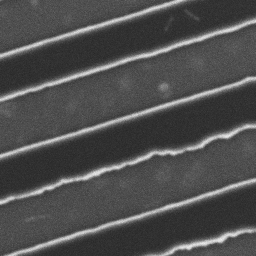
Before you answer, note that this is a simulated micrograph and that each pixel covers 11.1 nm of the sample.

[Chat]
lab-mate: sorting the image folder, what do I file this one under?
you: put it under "one or a few lines or trenches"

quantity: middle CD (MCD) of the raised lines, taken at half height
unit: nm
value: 499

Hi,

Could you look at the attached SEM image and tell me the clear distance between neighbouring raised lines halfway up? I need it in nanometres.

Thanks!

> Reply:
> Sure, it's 584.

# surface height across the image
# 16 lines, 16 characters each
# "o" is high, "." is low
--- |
..........oooooo
......oooooooooo
...ooooooooo....
ooooooooo.......
oooooo..........
ooo...........oo
...........ooooo
.......ooooooooo
....oooooooooo..
.oooooooooo.....
ooooooo.........
oooo...........o
o...........oooo
.........ooooooo
.....oooooooooo.
..ooooooooo.....